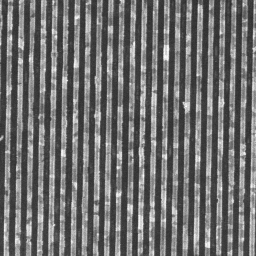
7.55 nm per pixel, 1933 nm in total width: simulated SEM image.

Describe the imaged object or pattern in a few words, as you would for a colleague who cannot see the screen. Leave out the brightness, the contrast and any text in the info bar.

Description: parallel lines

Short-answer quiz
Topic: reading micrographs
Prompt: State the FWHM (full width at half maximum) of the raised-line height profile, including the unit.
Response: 0.0293 microns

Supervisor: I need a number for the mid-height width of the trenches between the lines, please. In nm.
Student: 51.9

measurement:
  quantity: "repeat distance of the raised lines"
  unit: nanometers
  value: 84.4